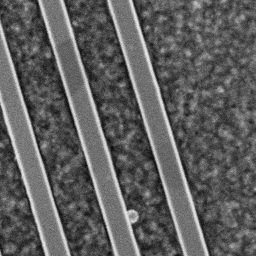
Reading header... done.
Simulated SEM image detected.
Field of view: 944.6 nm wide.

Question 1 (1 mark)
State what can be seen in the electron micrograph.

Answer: one or a few lines or trenches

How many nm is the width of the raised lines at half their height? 81.8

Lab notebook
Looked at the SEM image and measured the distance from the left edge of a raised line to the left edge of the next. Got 244 nanometers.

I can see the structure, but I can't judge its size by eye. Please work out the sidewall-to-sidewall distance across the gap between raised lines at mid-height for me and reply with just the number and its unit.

164 nm